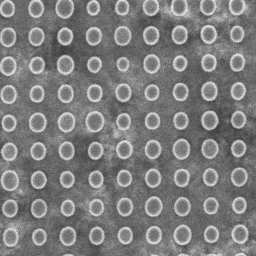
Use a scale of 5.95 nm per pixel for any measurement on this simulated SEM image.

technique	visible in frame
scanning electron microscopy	a regular array of raised bodies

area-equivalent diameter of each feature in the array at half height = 94.9 nm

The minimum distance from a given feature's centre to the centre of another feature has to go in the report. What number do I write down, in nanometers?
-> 168